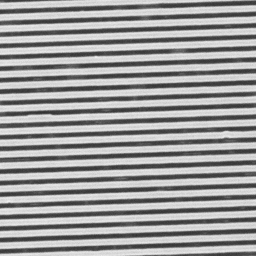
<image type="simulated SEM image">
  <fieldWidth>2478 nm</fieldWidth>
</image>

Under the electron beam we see parallel lines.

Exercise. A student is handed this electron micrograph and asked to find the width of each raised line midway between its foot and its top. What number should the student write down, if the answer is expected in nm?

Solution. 55.6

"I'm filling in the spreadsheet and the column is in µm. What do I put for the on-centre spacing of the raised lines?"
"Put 0.11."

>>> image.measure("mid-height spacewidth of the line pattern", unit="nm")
54.4